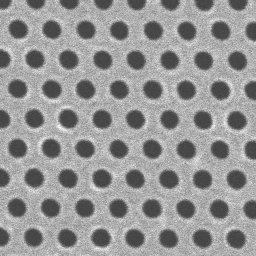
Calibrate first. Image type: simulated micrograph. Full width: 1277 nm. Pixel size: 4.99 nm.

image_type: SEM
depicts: a regular array of holes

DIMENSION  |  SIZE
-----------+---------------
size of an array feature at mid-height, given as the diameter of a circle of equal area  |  96 nanometres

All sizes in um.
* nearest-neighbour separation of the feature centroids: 0.168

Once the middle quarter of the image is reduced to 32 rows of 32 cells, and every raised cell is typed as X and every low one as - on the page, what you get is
---XXXXX----XXXX----XXXXX---XXXX
XXXXXXXXXXXXXXXXXXXXXXXXXX-XXXXX
XXXXXXXXXXXXXXXXXXXXXXXXXXXXXXXX
XXXXXXXXXXXXXXXXXXXXXXXXXXXXXXXX
XXXX---XXXXX---XXXXXX--XXXXXX---
XXX-----XXX-----XXXX----XXXX----
XXX-----XXX-----XXXX-----XXX----
XXX-----XXXX----XXXX-----XXX----
XXXX---XXXXXX--XXXXXX---XXXXX---
XXXXXXXXXXXXXXXXXXXXXXXXXXXXXXXX
XXXXXXXXXXXXXXXXXXXXXXXXXXXXXXXX
--XXXXXXX-XXXXXXX-XXXXXXXXXXXXXX
---XXXX----XXXXX----XXXX----XXXX
----XXX-----XXX-----XXXX-----XXX
---XXXX-----XXXX----XXXX-----XXX
---XXXXX---XXXXX----XXXXX---XXXX
XXXXXXXXXXXXXXXXXXXXXXXXXXXXXXXX
XXXXXXXXXXXXXXXXXXXXXXXXXXXXXXXX
XXXXXXXXXXXXXXXXXXXXXXXXXXXXXXXX
XXX----XXXXX---XXXXX---XXXXXX---
XXX----XXXX-----XXXX----XXXX----
XXX-----XXX-----XXXX----XXXX----
XXX-----XXXX----XXXX----XXXX----
XXXXX-XXXXXXX--XXXXXX--XXXXXXX--
XXXXXXXXXXXXXXXXXXXXXXXXXXXXXXXX
XXXXXXXXXXXXXXXXXXXXXXXXXXXXXXXX
--XXXXXXX-XXXXXXX-XXXXXXX--XXXXX
---XXXX----XXXXX----XXXX----XXXX
---XXXX-----XXX-----XXXX-----XXX
---XXXX-----XXX-----XXXX-----XXX
---XXXXX---XXXXX----XXXXX---XXXX
XXXXXXXXXXXXXXXXXXXXXXXXXXXXXXXX